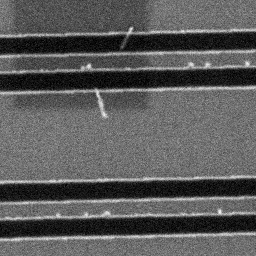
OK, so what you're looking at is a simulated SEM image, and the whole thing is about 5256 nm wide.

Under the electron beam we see lines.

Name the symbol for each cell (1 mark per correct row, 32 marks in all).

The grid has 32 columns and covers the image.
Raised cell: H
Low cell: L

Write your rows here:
LLLLLLLLLLLLLLLLLLLLLLLLLLLLLLLL
LLLLLLLLLLLLLLLLLLLLLLLLLLLLLLLL
LLLLLLLLLLLLLLLLLLLLLLLLLLLLLLLL
LLLLLLLLLLLLLLLLLLLLLLLLLLLLLLLL
HHHHHHHHHHHHHHHHHHHHHHHHHHHHHHHH
HHHHHHHHHHHHHHHHHHHHHHHHHHHHHHHH
HHHHHHHHHHHHHHHHHHHHHHHHHHHHLLLL
LLLLLLLLLLLLLLLLLLLLLLLLLLLLLLLL
LLLLLLLLLLLHLLLLLLLLLLLHHHHHHHHH
HHHHHHHHHHHHHHHHHHHHHHHHHHHHHHHH
HHHHHHHHHHHHHHHHHHHHHHHHHHHHHHHH
HHHHHHHHHHLLHLLLLLLLLLLLLLLLLLLL
LLLLLLLLLLLLLLLLLLLLLLLLLLLLLLLL
LLLLLLLLLLLLLLLLLLLLLLLLLLLLLLLL
LLLLLLLLLLLLLLLLLLLLLLLLLLLLLLLL
LLLLLLLLLLLLLLLLLLLLLLLLLLLLLLLL
LLLLLLLLLLLLLLLLLLLLLLLLLLLLLLLL
LLLLLLLLLLLLLLLLLLLLLLLLLLLLLLLL
LLLLLLLLLLLLLLLLLLLLLLLLLLLLLLLL
LLLLLLLLLLLLLLLLLLLLLLLLLLLLLLLL
LLLLLLLLLLLLLLLLLLLLLLLLLLLLLLLL
LLLLLLLLLLLLLLLLLLLLLLLLLLLLLLLL
LLLLLLLLLLLLHHHHHHHHHHHHHHHHHHHH
HHHHHHHHHHHHHHHHHHHHHHHHHHHHHHHH
HHHHHHHHHHHHHHHHHHHHHHHHHHHHHHHH
LLLLLLLLLLLLLLLLLLLLLLLLLLLLLLLL
LLLLLLLLLLLLLLLLLLLLLLLLLLLLLLLL
HHHHHHHHHHHHHHHHHHHHHHHHHHHHHHHH
HHHHHHHHHHHHHHHHHHHHHHHHHHHHHHHH
HHHHHHHHHHHHHHHHHHHLLLLLLLLLLLLL
LLLLLLLLLLLLLLLLLLLLLLLLLLLLLLLL
LLLLLLLLLLLLLLLLLLLLLLLLLLLLLLLL